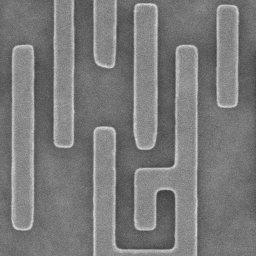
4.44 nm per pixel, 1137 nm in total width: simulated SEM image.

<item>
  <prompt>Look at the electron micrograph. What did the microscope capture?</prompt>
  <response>wiring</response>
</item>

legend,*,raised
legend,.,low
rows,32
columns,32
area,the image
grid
.......**...**..................
.......**...**...***.......***..
.......**...**...***.......***..
.......**...**...***.......***..
.......**...**...***.......***..
.......**...**...***.......***..
..**...**...**...***..***..***..
..**...**...**...***..***..***..
..**...**........***..***..***..
..**...**........***..***..***..
..**...**........***..***..***..
..**...**........***..***..***..
..**...**........***..***..***..
..**...**........***..***.......
..**...**........***..***.......
..**...**........***..***.......
..**...**...**...***..***.......
..**...**...**...**...***.......
..**........**...**...***.......
..**........**........***.......
.***........**........***.......
.***........**...********.......
.***........**...********.......
.***........**...********.......
..**........**...***..***.......
.***........**...**...***.......
.***........**...**...***.......
.***........**...**...***.......
..**........**...**...***.......
............**........***.......
............**........***.......
............*************.......